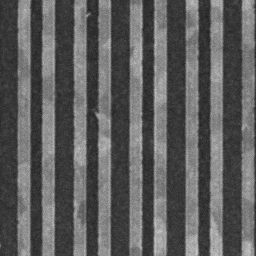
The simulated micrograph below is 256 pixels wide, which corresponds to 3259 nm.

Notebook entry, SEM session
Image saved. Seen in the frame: parallel lines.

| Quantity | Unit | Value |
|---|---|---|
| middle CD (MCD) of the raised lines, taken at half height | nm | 135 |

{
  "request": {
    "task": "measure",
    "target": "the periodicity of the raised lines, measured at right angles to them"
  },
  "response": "357 nm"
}